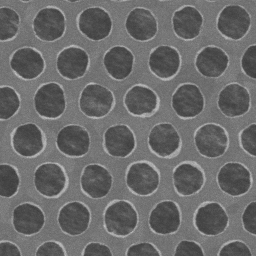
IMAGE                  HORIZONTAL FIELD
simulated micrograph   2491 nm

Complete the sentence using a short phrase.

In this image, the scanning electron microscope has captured a regular array of holes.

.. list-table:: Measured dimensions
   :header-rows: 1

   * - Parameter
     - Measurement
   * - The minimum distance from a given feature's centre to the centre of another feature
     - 0.435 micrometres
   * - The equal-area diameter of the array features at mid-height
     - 0.317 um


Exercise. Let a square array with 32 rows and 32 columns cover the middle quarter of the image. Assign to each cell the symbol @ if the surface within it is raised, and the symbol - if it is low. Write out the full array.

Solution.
------@@@@-------@@@@--------@@@
------@@@@@------@@@@@------@@@@
-----@@@@@@@----@@@@@@@-----@@@@
----@@@@@@@@@--@@@@@@@@@--@@@@@@
@@@@@@@@@@@@@@@@@@@@@@@@@@@@@@@@
@@@@@@---@@@@@@@@@--@@@@@@@@@---
@@@@@------@@@@@------@@@@@@----
@@@@--------@@@--------@@@@@----
@@@@---------@@--------@@@@-----
@@@@---------@@---------@@@-----
@@@@--------@@@---------@@@-----
@@@@--------@@@@-------@@@@@----
@@@@@------@@@@@@-----@@@@@@----
@@@@@@@@-@@@@@@@@@@@@@@@@@@@@@@@
@@@@@@@@@@@@@@@@@@@@@@@@@@@@@@@@
@---@@@@@@@@@--@@@@@@@@----@@@@@
------@@@@@------@@@@@------@@@@
------@@@@-------@@@@--------@@@
------@@@@--------@@@--------@@@
------@@@@--------@@@--------@@@
------@@@@--------@@@--------@@@
------@@@@-------@@@@@-------@@@
-----@@@@@@-----@@@@@@@----@@@@@
@@@@@@@@@@@@@@@@@@@@@@@@@@@@@@@@
@@@@@@@@@@@@@@@@@@---@@@@@@@@@@@
@@@@@@---@@@@@@@@-----@@@@@@----
@@@@@------@@@@@-------@@@@@----
@@@@@-------@@@@--------@@@-----
-@@@--------@@@---------@@@-----
-@@@--------@@@@--------@@@-----
@@@@@-------@@@@--------@@@@----
@@@@@------@@@@@@------@@@@@----